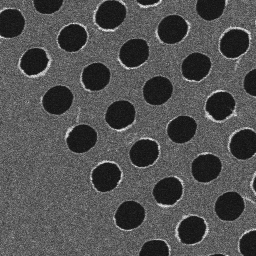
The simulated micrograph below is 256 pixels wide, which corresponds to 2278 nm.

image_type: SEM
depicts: a regular array of holes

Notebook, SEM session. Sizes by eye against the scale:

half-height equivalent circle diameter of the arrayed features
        259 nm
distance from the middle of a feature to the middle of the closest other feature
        398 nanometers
